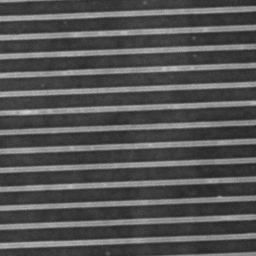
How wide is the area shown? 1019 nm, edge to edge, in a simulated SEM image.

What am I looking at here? parallel lines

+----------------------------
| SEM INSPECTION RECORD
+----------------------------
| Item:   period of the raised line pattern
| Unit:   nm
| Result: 75.2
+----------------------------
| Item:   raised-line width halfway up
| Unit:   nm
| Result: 16.9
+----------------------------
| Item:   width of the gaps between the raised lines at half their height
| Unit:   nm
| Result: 57.1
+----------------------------